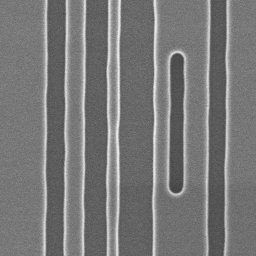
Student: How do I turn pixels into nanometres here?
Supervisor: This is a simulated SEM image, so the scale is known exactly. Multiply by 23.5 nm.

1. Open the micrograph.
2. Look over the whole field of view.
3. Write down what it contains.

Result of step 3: groups of lines, slits or small figures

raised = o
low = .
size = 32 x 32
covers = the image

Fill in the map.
oooooo..ooo...o....ooooooo..oooo
oooooo..ooo...o....ooooooo..oooo
oooooo..ooo...o.....oooooo..oooo
oooooo..ooo...o....ooooooo..oooo
oooooo..oo....o....ooooooo..oooo
oooooo..ooo...o....ooooooo..oooo
oooooo..ooo...o....ooooooo..oooo
oooooo..ooo...o....oo..ooo..oooo
oooooo..oo...oo....oo..ooo..oooo
oooooo..ooo..oo....oo..ooo..oooo
oooooo..oo...oo....oo..ooo..oooo
oooooo..oo....o....oo..ooo..oooo
oooooo..oo...oo....oo..ooo..oooo
oooooo..oo...oo....oo..ooo..oooo
oooooo..oo...oo....oo..ooo..oooo
oooooo..oo....o....oo..ooo..oooo
oooooo..oo....o....oo..ooo..oooo
oooooo..oo....o....oo..ooo..oooo
oooooo..oo....o....oo..ooo..oooo
oooooo..oo...oo....oo..ooo..oooo
oooooo..oo...oo....oo..ooo..oooo
oooooo..oo...oo....oo..ooo..oooo
oooooo..oo...oo....oo..ooo..oooo
oooooo..oo...oo....oo..ooo..oooo
oooooo..oo...oo....ooooooo..oooo
oooooo..oo...oo....ooooooo..oooo
oooooo..oo...oo....ooooooo..oooo
oooooo..oo...oo....ooooooo..oooo
oooooo..oo...oo....ooooooo..oooo
oooooo..oo...oo....ooooooo..oooo
oooooo..oo...oo....ooooooo..oooo
oooooo..oo...oo....ooooooo..oooo